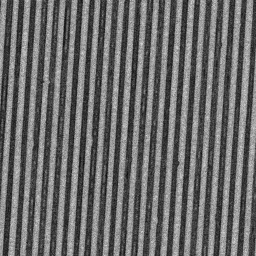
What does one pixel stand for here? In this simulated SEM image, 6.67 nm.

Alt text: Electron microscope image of parallel lines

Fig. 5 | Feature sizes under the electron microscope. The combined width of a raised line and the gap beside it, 77.9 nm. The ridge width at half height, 36.6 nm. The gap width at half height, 42.4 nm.